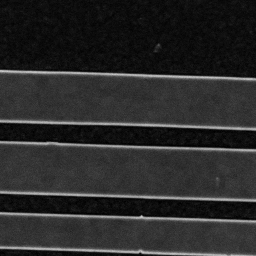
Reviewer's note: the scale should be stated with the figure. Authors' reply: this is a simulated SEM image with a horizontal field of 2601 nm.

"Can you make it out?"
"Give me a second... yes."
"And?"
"one or a few lines or trenches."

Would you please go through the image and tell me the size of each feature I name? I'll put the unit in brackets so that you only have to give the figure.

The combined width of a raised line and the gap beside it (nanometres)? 690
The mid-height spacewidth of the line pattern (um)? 0.207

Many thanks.